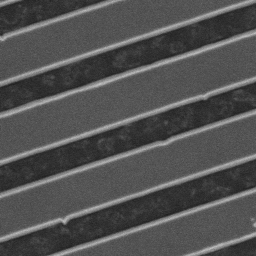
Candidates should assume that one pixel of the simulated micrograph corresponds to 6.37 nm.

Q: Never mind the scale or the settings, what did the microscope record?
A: one or a few lines or trenches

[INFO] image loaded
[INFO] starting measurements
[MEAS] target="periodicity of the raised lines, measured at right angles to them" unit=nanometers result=474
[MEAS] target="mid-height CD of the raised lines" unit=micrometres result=0.285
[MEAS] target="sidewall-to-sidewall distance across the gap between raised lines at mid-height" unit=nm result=190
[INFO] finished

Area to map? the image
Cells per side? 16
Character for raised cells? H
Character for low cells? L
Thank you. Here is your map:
LLLLLLHHHHHHHHHL
LLLHHHHHHHHHLLLL
HHHHHHHHLLLLLLHH
HHHHHLLLLLLHHHHH
HHLLLLLLHHHHHHHH
LLLLLHHHHHHHHHLL
LLHHHHHHHHHLLLLL
HHHHHHHHLLLLLLHH
HHHHHLLLLLLHHHHH
HHLLLLLLHHHHHHHH
LLLLLHHHHHHHHHLL
LLHHHHHHHHHLLLLL
HHHHHHHHLLLLLLHH
HHHHHLLLLLLHHHHH
HHLLLLLLHHHHHHHH
LLLLLHHHHHHHHHLL